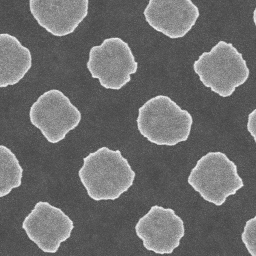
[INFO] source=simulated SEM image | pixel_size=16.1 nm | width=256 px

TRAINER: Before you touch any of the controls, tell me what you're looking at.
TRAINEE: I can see a regular array of raised bodies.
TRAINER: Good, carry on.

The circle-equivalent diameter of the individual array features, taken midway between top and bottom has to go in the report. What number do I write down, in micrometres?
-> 0.778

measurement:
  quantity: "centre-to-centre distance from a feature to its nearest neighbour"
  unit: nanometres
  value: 1250